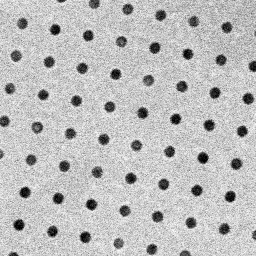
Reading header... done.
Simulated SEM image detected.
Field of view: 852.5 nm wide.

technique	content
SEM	a regular array of holes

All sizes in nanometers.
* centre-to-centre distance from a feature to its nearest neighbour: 110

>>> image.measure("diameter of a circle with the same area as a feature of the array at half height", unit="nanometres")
39.9